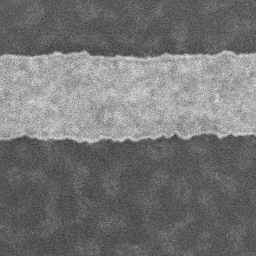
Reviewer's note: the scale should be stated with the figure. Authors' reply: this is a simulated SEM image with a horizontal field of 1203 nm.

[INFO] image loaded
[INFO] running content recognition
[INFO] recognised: one or a few lines or trenches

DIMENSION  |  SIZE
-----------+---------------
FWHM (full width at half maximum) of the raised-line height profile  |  382 nanometers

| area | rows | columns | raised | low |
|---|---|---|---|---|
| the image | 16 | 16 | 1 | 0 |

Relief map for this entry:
0000000000000000
0000000000000000
0000000000000000
0001110000111111
1111111111111111
1111111111111111
1111111111111111
1111111111111111
1111111111010000
0000000000000000
0000000000000000
0000000000000000
0000000000000000
0000000000000000
0000000000000000
0000000000000000